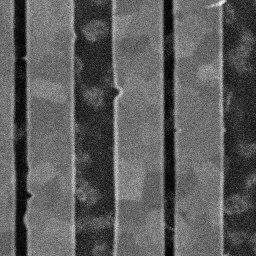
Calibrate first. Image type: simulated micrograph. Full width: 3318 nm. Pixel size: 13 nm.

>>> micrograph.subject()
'one or a few lines or trenches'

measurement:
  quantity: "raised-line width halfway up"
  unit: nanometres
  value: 604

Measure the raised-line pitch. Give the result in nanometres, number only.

960